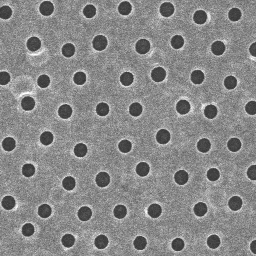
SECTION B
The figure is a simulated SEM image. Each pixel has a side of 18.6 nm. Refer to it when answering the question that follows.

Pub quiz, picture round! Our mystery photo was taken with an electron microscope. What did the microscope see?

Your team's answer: a regular array of holes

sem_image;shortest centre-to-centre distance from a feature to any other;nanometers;607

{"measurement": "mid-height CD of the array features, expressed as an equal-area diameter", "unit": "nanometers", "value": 268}